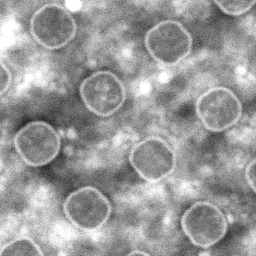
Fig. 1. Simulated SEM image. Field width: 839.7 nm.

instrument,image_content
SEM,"a regular array of raised bodies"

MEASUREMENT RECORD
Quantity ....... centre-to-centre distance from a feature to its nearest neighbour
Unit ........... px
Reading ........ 82.6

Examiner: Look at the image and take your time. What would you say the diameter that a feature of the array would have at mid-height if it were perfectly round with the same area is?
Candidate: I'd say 140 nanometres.